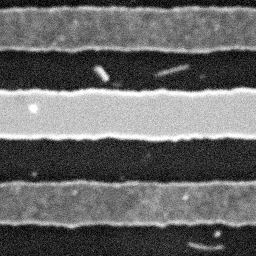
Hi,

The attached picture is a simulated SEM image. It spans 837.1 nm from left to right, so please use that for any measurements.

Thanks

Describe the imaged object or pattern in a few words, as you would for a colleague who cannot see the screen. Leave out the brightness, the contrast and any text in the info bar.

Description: lines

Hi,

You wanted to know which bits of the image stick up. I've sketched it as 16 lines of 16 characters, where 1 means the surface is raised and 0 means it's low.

0000111100011000
1111111111111111
1111111111111111
0000000000000000
0000000000000000
0000000000000000
1111111111111111
1111111111111111
1111111111111111
0000000000000000
0000000000000000
1111111111111111
1111111111111111
1111111111111111
0000000000000000
0000000000000000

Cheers